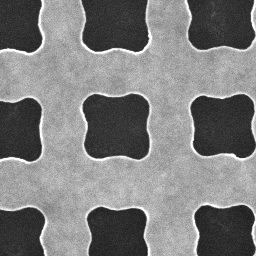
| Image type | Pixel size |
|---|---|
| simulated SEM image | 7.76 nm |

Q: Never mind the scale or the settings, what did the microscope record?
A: holes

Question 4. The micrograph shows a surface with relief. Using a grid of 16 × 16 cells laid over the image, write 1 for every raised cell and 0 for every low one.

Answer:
0001100001110000
0011100001110000
0001100001110000
1111111111111111
1111111111111111
1111111111111111
0011100001110000
0001100001110000
0001100001110000
0001100001110000
1111111111111111
1111111111111111
1111111111111111
0001110001110000
0001110001110000
0001110001110000